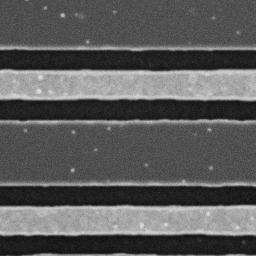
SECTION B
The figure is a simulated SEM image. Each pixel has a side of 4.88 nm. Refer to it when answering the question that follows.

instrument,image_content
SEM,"lines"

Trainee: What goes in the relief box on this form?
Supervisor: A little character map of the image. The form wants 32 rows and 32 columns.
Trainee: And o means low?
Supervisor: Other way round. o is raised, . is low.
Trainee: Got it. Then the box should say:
oooooooooooooooooooooooooooooooo
oooooooooooooooooooooooooooooooo
oooooooooooooooooooooooooooooooo
oooooooooooooooooooooooooooooooo
oooooooooooooooooooooooooooooooo
oooooooooooooooooooooooooooooooo
................................
................................
................................
oooooooooooooooooooooooooooooooo
oooooooooooooooooooooooooooooooo
oooooooooooooooooooooooooooooooo
..............................oo
................................
................................
oooooooooooooooooooooooooooooooo
oooooooooooooooooooooooooooooooo
oooooooooooooooooooooooooooooooo
oooooooooooooooooooooooooooooooo
oooooooooooooooooooooooooooooooo
oooooooooooooooooooooooooooooooo
oooooooooooooooooooooooooooooooo
oooooooooooooooooooooooooooooooo
................................
................................
................................
oooooooooooooooooooooooooooooooo
oooooooooooooooooooooooooooooooo
oooooooooooooooooooooooooooooooo
................................
................................
................................